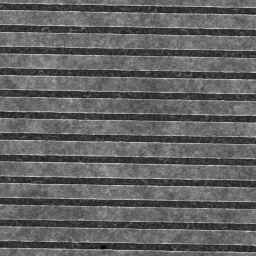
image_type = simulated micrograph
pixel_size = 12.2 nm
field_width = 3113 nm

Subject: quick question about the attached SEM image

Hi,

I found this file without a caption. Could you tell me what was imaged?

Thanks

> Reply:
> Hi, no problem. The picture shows parallel lines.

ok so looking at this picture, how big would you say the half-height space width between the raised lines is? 0.0851 um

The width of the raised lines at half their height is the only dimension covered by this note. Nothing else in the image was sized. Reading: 0.175 µm